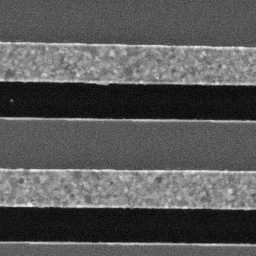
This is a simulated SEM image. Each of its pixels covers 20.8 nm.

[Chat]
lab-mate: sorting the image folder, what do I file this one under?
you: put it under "lines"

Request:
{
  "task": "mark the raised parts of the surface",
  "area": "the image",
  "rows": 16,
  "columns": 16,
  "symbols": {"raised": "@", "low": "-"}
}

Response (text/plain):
@@@@@@@@@@@@@@@@
@@@@@@@@@@@@@@@@
@@@@@@@@@@@@@@@@
@@@@@@@@@@@@@@@@
@@@@@@@@@@@@@@@@
----------------
----------------
@@@@@@@@@@------
@@@@@@@@@@@@@@@@
@@@@@@@@@@@@@@@@
@@@@@@@@@@@@@@@@
@@@@@@@@@@@@@@@@
@@@@@@@@@@@@@@@@
----------------
----------------
@@@@@@@@@@@@@@@@